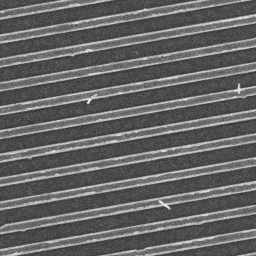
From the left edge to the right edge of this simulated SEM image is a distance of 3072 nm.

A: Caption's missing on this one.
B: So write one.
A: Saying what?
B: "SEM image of parallel lines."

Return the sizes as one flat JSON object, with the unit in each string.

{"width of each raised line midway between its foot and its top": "100 nanometres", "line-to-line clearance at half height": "15.2 px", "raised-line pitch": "282 nanometers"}